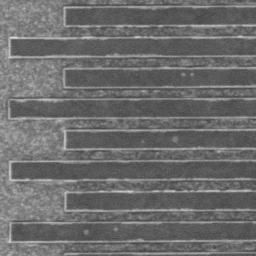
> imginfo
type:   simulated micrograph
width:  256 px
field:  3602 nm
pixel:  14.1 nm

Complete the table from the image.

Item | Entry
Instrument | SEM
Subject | parallel lines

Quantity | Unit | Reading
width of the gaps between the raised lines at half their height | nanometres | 158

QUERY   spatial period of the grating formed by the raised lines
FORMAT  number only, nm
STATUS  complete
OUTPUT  433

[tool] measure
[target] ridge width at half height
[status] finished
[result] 267 nanometers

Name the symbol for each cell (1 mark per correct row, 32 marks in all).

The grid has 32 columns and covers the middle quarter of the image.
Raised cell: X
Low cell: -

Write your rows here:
--------------------------------
XXXXXXXXXXXXXXXXXXXXXXXXXXXXXXXX
XXXXXXXXXXXXXXXXXXXXXXXXXXXXXXXX
XXXXXXXXXXXXXXXXXXXXXXXXXXXXXXXX
XXXXXXXXXXXXXXXXXXXXXXXXXXXXXXXX
XXXXXXXXXXXXXXXXXXXXXXXXXXXXXXXX
--------------------------------
--------------------------------
--------------------------------
XXXXXXXXXXXXXXXXXXXXXXXXXXXXXXXX
XXXXXXXXXXXXXXXXXXXXXXXXXXXXXXXX
XXXXXXXXXXXXXXXXXXXXXXXXXXXXXXXX
XXXXXXXXXXXXXXXXXXXXXXXXXXXXXXXX
XXXXXX--------------------------
--------------------------------
--------------------------------
-----------------------XXXXXXXX-
XXXXXXXXXXXXXXXXXXXXXXXXXXXXXXXX
XXXXXXXXXXXXXXXXXXXXXXXXXXXXXXXX
XXXXXXXXXXXXXXXXXXXXXXXXXXXXXXXX
XXXXXXXXXXXXXXXXXXXXXXXXXXXXXXXX
--------------------------------
--------------------------------
--------------------------------
XXXXXXXXXXXXXXXXXXXXXXXXXXXXXXXX
XXXXXXXXXXXXXXXXXXXXXXXXXXXXXXXX
XXXXXXXXXXXXXXXXXXXXXXXXXXXXXXXX
XXXXXXXXXXXXXXXXXXXXXXXXXXXXXXXX
XXXXXXXXXXXXXXXXXXXXXXXXXXXXXXXX
--------------------------------
--------------------------------
--------------------------------